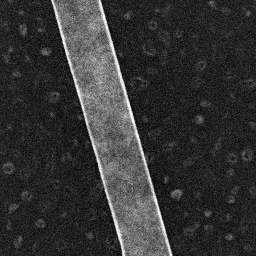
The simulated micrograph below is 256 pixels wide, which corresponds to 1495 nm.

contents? one or a few lines or trenches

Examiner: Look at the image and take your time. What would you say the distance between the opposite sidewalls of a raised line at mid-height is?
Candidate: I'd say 269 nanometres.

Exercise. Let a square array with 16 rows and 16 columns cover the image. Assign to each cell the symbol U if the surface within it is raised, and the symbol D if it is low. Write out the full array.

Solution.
DDDUUUDDDDDDDDDD
DDDDUUUDDDDDDDDD
DDDDUUUDDDDDDDDD
DDDDUUUDDDDDDDDD
DDDDDUUDDDDDDDDD
DDDDDUUUDDDDDDDD
DDDDDUUUDDDDDDDD
DDDDDUUUDDDDDDDD
DDDDDDUUUDDDDDDD
DDDDDDUUUDDDDDDD
DDDDDDUUUDDDDDDD
DDDDDDUUUDDDDDDD
DDDDDDDUUUDDDDDD
DDDDDDDUUUDDDDDD
DDDDDDDUUUDDDDDD
DDDDDDDDUUUDDDDD